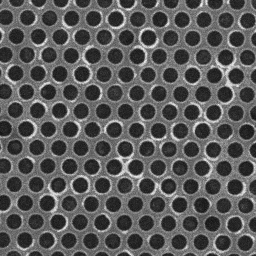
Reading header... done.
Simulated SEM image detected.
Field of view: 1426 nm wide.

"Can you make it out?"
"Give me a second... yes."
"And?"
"a regular array of holes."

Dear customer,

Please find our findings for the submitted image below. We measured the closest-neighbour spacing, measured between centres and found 119 nm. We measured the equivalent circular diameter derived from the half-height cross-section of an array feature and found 89.6 nanometres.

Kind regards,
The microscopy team